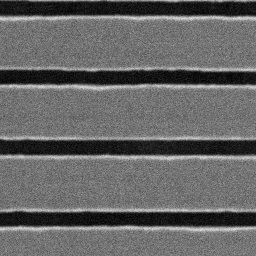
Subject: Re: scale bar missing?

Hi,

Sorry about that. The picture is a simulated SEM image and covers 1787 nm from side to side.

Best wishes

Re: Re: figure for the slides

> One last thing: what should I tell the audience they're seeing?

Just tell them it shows lines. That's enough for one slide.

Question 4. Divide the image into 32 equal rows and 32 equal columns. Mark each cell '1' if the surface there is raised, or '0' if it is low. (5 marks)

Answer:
00000000000000000000000000000000
00000000000000000000000000000000
11111111111111111111111111111111
11111111111111111111111111111111
11111111111111111111111111111111
11111111111111111111111111111111
11111111111111111111111111111111
11111111111111111111111111111111
11111111111111111111111111111111
00000000000000000000000000000000
00000000000000000000000000000000
11111111111111111111111111111111
11111111111111111111111111111111
11111111111111111111111111111111
11111111111111111111111111111111
11111111111111111111111111111111
11111111111111111111111111111111
00000000000000000000010000000000
00000000000000000000000000000000
11111110011111100110000010000000
11111111111111111111111111111111
11111111111111111111111111111111
11111111111111111111111111111111
11111111111111111111111111111111
11111111111111111111111111111111
11111111111111111111111111111111
00000000000000000000000000000000
00000000000000000000000000000000
11111111111111111111111100101111
11111111111111111111111111111111
11111111111111111111111111111111
11111111111111111111111111111111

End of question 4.